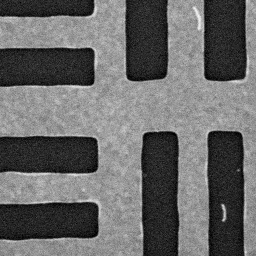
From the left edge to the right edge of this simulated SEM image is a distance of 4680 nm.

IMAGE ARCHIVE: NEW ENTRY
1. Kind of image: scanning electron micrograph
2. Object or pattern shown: groups of lines, slits or small figures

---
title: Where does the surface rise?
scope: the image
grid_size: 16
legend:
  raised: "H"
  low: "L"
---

LLLLLLHHLLLHHLLH
HHHHHHHHLLLHHLLH
HHHHHHHHLLLHHLLH
LLLLLLHHLLLHHLLH
LLLLLLHHLLHHHLLH
HHHHHHHHHHHHHHHH
HHHHHHHHHHHHHHHH
HHHHHHHHHHHHHHHH
HHLLLHHHHLLHHLLH
LLLLLLHHHLLHHLLH
LLLLLLHHHLLHHLLH
HHHHHHHHHLLHHLLH
HHHHHHHHHLLHHLLH
LLLLLLHHHLLHHLLH
LLLLLLHHHLLHHLLH
HHHHHHHHHLLHHLLH